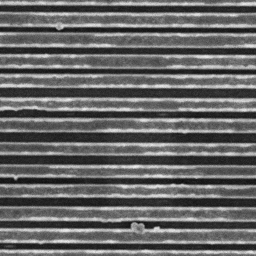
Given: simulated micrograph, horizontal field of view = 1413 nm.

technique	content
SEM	parallel lines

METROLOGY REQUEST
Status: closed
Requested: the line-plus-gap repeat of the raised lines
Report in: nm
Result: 119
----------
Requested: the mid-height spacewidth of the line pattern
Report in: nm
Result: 46.2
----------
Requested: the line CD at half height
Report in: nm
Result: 69.7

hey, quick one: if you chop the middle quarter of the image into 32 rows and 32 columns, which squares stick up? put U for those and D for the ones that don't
UUUUUUUUUUUUUUUUUUUUUUUUUUUUUUUU
DDDDDDDDDDDDDDDDDDDDDDDDDDDDDDDD
DDDDDDDDDDDDDDDDDDDDDDDDDDDDDDDD
UUUUUUUUUUUUUUUUUUUUUUUUUUUUUUUU
UUUUUUUUUUUUUUUUUUUUUUUUUUUUUUUU
DUUUUUUUUUUUUUUUUUUUUUUUUUUUUUUU
DDDDDDDDDDDDDDDDDDDDDDDDDDDDDDDD
DDDDDDDDDDDDDDDDDDDDDDDDDDDDDDDD
DDDDDDDDDDDDDDDDDDDDDDDDDDDDDDDD
UUUUUUUUUUUUUUUUUUUUUUUUUUUUUUUU
UUUUUUUUUUUUUUUUUUUUUUUUUUUUUUUU
DDDDUUDDUUUDDUUUUUDDDDDDDDDDDUUU
DDDDDDDDDDDDDDDDDDDDDDDDDDDDDDDD
DDDDDDDDDDDDDDDDDDDDDDDDDDDDDDDD
UUUUUUUUUUUUUUUUUUUUUUUUUUUUUUUU
UUUUUUUUUUUUUUUUUUUUUUUUUUUUUUUU
UUUUUUUUUUUUUUUUUUUUUUUUUUUUUUUU
DDDDDDDDDDDDDDDDDDDDDDDDDDDDDDDD
DDDDDDDDDDDDDDDDDDDDDDDDDDDDDDDD
DDDDDDDDDDDDDDDDDDDDDDDDDDDDDDDD
UUUUUUUUUUUUUUUUUUUUUUUUUUUUUUUU
UUUUUUUUUUUUUUUUUUUUUUUUUUUUUUUU
DUDUUUDDUDUUUUUUDDDDDDDDDDDDDDDD
DDDDDDDDDDDDDDDDDDDDDDDDDDDDDDDD
DDDDDDDDDDDDDDDDDDDDDDDDDDDDDDDD
DDDDDDDDDDUUDDUDDUUDDDDDDDDDDDDD
UUUUUUUUUUUUUUUUUUUUUUUUUUUUUUUU
UUUUUUUUUUUUUUUUUUUUUUUUUUUUUUUU
DDDDDDDDDDDDDDDDDDDDDDDDDDDDDDDD
DDDDDDDDDDDDDDDDDDDDDDDDDDDDDDDD
UUUUUUUUUUUUUUUUUUUUUUUUUUUUUUUU
UUUUUUUUUUUUUUUUUUUUUUUUUUUUUUUU